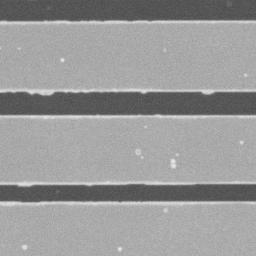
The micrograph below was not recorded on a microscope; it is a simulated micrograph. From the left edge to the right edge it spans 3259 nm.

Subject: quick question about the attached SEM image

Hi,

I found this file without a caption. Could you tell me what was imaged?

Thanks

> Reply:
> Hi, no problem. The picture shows lines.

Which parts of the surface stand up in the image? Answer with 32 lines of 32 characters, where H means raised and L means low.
LLLLLLLLLLLLLLLLLLLLLLLLLLLLLLLL
LLLLLLLLLLLLLLLLLLLLLLLLLLLLLLLL
LLLLLLLLLLLLLLLLLLLLLLLLLLLLLLLL
HHHHHHHHHHHHHHHHHHHHHHHHHHHHHHHH
HHHHHHHHHHHHHHHHHHHHHHHHHHHHHHHH
HHHHHHHHHHHHHHHHHHHHHHHHHHHHHHHH
HHHHHHHHHHHHHHHHHHHHHHHHHHHHHHHH
HHHHHHHHHHHHHHHHHHHHHHHHHHHHHHHH
HHHHHHHHHHHHHHHHHHHHHHHHHHHHHHHH
HHHHHHHHHHHHHHHHHHHHHHHHHHHHHHHH
HHHHHHHHHHHHHHHHHHHHHHHHHHHHHHHH
LLLLLLLLLLLLLLLLLLLLLLLLLLLLLLLL
LLLLLLLLLLLLLLLLLLLLLLLLLLLLLLLL
LLLLLLLLLLLLLLLLLLLLLLLLLLLLLLLL
LLLLLLLLLLLLLLLLLLLHLLLLLLLLLLLL
HHHHHHHHHHHHHHHHHHHHHHHHHHHHHHHH
HHHHHHHHHHHHHHHHHHHHHHHHHHHHHHHH
HHHHHHHHHHHHHHHHHHHHHHHHHHHHHHHH
HHHHHHHHHHHHHHHHHHHHHHHHHHHHHHHH
HHHHHHHHHHHHHHHHHHHHHHHHHHHHHHHH
HHHHHHHHHHHHHHHHHHHHHHHHHHHHHHHH
HHHHHHHHHHHHHHHHHHHHHHHHHHHHHHHH
HHHHHHHHHHHHHHHHHHHHHHHHHHHHHHHH
LLLLLLLLLLLLLLLLLLLLLLLLLLLLLLLL
LLLLLLLLLLLLLLLLLLLLLLLLLLLLLLLL
HHHHHHHHHHHHHHHHHHHHHHHHHHHHHHHH
HHHHHHHHHHHHHHHHHHHHHHHHHHHHHHHH
HHHHHHHHHHHHHHHHHHHHHHHHHHHHHHHH
HHHHHHHHHHHHHHHHHHHHHHHHHHHHHHHH
HHHHHHHHHHHHHHHHHHHHHHHHHHHHHHHH
HHHHHHHHHHHHHHHHHHHHHHHHHHHHHHHH
HHHHHHHHHHHHHHHHHHHHHHHHHHHHHHHH